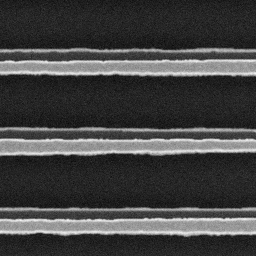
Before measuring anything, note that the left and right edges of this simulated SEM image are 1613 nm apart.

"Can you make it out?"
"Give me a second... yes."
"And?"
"lines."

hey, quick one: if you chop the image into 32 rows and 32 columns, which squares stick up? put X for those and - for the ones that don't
--------------------------------
--------------------------------
--------------------------------
--------------------------------
--------------------------------
--------------------------------
XXXXXXXXXXXXXXXXXXXXXXXXXXXXXXXX
XXXXXXXXXXXXXXXXXXXXXXXXXXXXXXXX
XXXXXXXXXXXXXXXXXXXXXXXXXXXXXXXX
--------------------------------
--------------------------------
--------------------------------
--------------------------------
--------------------------------
--------------------------------
--------------------------------
XXXXXXXXXXXXXXXXXXXXXXXXXXXXXXXX
XXXXXXXXXXXXXXXXXXXXXXXXXXXXXXXX
XXXXXXXXXXXXXXXXXXXXXXXXXXXXXXXX
--------------------------------
--------------------------------
--------------------------------
--------------------------------
--------------------------------
--------------------------------
--------------------------------
XXXXXXXXXXXXXXXXXXXXXXXXXXXXXXXX
XXXXXXXXXXXXXXXXXXXXXXXXXXXXXXXX
XXXXXXXXXXXXXXXXXXXXXXXXXXXXXXXX
--------------------------------
--------------------------------
--------------------------------